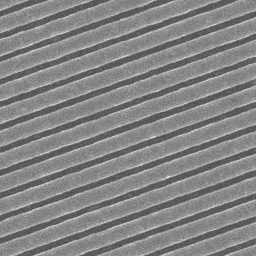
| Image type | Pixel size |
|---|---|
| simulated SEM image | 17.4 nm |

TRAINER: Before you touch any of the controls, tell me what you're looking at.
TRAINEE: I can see parallel lines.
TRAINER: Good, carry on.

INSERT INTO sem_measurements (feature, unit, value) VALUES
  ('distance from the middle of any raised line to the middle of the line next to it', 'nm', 373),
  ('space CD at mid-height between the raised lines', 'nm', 109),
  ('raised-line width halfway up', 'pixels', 15.1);